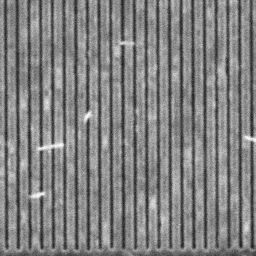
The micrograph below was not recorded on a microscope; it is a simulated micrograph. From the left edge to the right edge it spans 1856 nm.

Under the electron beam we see parallel lines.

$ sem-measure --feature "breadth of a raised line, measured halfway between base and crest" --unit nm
55.3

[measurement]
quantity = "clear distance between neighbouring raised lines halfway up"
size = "30.8 nm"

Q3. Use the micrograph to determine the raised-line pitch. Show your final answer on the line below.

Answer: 84.8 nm